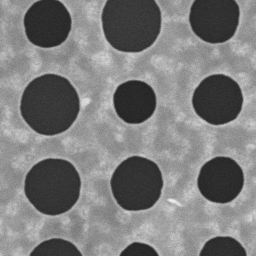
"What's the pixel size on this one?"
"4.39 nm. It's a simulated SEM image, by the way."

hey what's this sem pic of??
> holes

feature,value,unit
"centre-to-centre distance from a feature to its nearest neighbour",358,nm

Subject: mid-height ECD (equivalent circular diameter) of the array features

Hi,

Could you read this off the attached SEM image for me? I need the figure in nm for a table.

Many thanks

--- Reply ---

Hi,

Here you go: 228